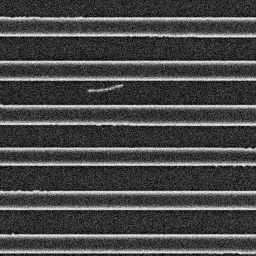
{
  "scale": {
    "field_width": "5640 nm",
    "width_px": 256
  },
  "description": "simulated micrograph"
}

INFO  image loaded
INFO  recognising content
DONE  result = lines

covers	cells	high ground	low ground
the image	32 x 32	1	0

00000000000000000000000000000000
00000000000000000000000000000000
11111111111111111111111111111111
11111111111111111111111111111111
00000000000000001001111111111111
00000000000000000000000000000000
00000000000000000000000000000000
00000000000000000000000000000000
11111111111111111111111111111111
11111111111111111111111111111111
00000000000000000000000000000000
00000000000000000000000000000000
00000000000000000000000000000000
11111111111111111111111111111111
11111111111111111111111111111111
11111111111111111111111111111111
00000000000000000000000000000000
00000000000000000000000000000000
00000000000000000000000000000000
11111111111111111111111111111111
11111111111111111111111111111111
00000000000000000000000000000000
00000000000000000000000000000000
00000000000000000000000000000000
11111111111111111111111111111111
11111111111111111111111111111111
00000000000000000000000000000000
00000000000000000000000000000000
00000000000000000000000000000000
11111111111111111111111111111111
11111111111111111111111111111111
11111111111111111111111111111111